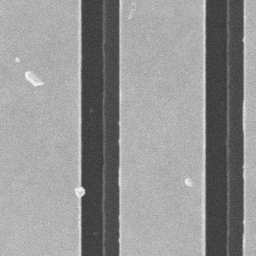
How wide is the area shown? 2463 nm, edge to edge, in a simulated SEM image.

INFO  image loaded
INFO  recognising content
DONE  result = lines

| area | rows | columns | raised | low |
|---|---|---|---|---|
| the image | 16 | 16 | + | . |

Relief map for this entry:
+++++...+++++..+
+++++...+++++..+
+++++...+++++..+
+++++...+++++..+
+++++...+++++..+
+++++...+++++..+
+++++...+++++..+
+++++..++++++..+
+++++..++++++..+
+++++...+++++..+
+++++..++++++..+
+++++..++++++..+
+++++...+++++..+
+++++..++++++..+
+++++..++++++..+
+++++..++++++..+